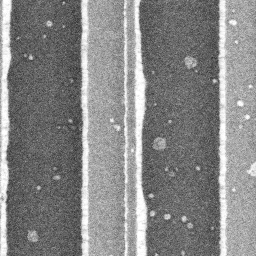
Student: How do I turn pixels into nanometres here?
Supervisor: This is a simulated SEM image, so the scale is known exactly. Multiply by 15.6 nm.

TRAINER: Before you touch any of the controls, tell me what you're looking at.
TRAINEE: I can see lines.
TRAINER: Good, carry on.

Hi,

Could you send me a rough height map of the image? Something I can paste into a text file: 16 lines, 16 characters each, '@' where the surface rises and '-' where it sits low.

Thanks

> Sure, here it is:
-----@@@@-----@@
-----@@@@-----@@
-----@@@@-----@@
-----@@@@-----@@
-----@@@@-----@@
-----@@@@-----@@
-----@@@@-----@@
-----@@@@-----@@
-----@@@@-----@@
-----@@@@-----@@
-----@@@@-----@@
-----@@@@-----@@
-----@@@@-----@@
-----@@@@-----@@
-----@@@@-----@@
-----@@@@-----@@